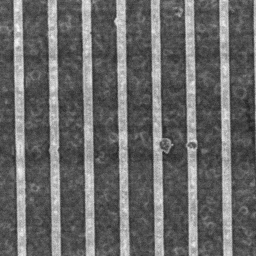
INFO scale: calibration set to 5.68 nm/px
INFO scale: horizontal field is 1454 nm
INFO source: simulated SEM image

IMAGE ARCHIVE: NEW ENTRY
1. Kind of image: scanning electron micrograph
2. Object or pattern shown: parallel lines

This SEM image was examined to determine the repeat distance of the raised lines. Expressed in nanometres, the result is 195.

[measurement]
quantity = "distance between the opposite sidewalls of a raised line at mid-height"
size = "43.3 nanometers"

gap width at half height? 0.148 microns